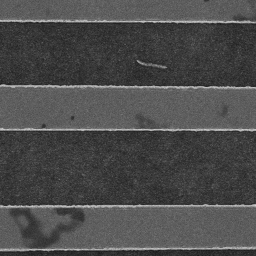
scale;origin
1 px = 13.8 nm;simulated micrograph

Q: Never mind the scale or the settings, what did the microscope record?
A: lines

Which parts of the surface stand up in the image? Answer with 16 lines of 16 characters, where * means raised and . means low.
****************
................
................
................
................
****************
****************
****************
................
................
................
................
................
****************
****************
****************